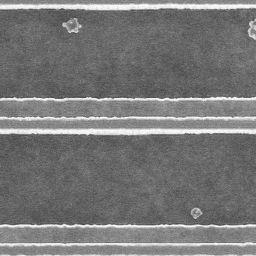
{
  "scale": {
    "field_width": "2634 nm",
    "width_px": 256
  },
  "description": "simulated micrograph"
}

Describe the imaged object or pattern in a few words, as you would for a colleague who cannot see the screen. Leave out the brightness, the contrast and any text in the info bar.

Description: lines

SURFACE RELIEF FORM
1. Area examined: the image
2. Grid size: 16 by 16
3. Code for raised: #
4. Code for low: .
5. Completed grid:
................
................
................
................
................
................
################
################
................
................
................
................
................
................
################
################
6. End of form